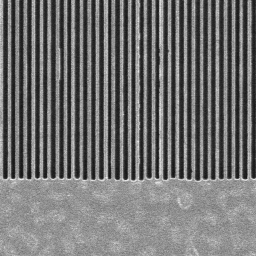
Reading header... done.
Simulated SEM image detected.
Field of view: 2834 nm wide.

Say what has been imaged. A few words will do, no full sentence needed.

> parallel lines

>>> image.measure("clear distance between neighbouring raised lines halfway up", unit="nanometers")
54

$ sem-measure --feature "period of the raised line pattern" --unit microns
0.0886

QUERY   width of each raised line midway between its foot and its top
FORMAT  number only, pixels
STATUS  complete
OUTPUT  3.44